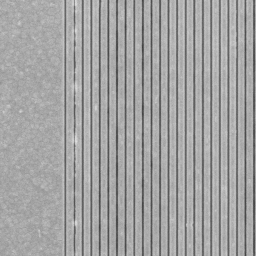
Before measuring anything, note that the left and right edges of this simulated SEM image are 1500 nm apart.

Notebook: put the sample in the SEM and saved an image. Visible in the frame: parallel lines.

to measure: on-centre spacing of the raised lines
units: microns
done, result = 0.0501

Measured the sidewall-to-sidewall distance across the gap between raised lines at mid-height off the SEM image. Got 10.3 nm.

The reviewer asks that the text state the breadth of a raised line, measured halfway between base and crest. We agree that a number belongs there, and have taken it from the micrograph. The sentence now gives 40.3 nm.